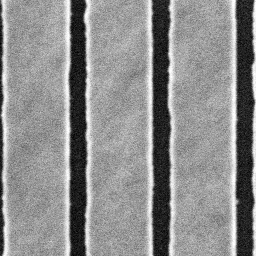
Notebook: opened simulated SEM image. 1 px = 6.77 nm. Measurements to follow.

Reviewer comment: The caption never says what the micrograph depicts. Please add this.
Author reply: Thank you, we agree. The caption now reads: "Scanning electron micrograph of lines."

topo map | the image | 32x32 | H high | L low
HHHHHHHHHLLHHHHHHHHLLHHHHHHHHLLL
HHHHHHHHHLLHHHHHHHHLLHHHHHHHHLLL
HHHHHHHHHLLHHHHHHHHLLHHHHHHHHLLL
HHHHHHHHHLLHHHHHHHHLLHHHHHHHHLLL
HHHHHHHHHLLHHHHHHHHLLHHHHHHHHLLL
HHHHHHHHHLLHHHHHHHHLLHHHHHHHHLLL
HHHHHHHHHLLHHHHHHHHLLHHHHHHHHLLL
HHHHHHHHHLLHHHHHHHHLLHHHHHHHHLLL
HHHHHHHHHLLHHHHHHHHLLHHHHHHHHLLL
HHHHHHHHLLLHHHHHHHHLLHHHHHHHHLLL
HHHHHHHHLLLHHHHHHHHLLHHHHHHHHLLL
HHHHHHHHHLLHHHHHHHHLLHHHHHHHHLLL
HHHHHHHHHLLHHHHHHHHLLHHHHHHHHLLL
HHHHHHHHHLLHHHHHHHHLLHHHHHHHHLLL
HHHHHHHHHLLHHHHHHHHLLHHHHHHHHLLL
HHHHHHHHHLLHHHHHHHHLLHHHHHHHHLLL
HHHHHHHHHLLHHHHHHHHLLHHHHHHHHLLL
HHHHHHHHHLLHHHHHHHHLLHHHHHHHHLLL
HHHHHHHHHLLHHHHHHHHLLHHHHHHHHLLL
HHHHHHHHHLLHHHHHHHHLLHHHHHHHHLLL
HHHHHHHHHLLHHHHHHHHLLHHHHHHHHLLL
HHHHHHHHHLLHHHHHHHHLLHHHHHHHHLLL
HHHHHHHHHLLHHHHHHHHLLHHHHHHHHLLL
HHHHHHHHHLLHHHHHHHHLLHHHHHHHHLLL
HHHHHHHHHLLHHHHHHHHLLHHHHHHHHLLL
HHHHHHHHHLLHHHHHHHHLLHHHHHHHHLLL
HHHHHHHHHLLHHHHHHHHLLHHHHHHHHLLL
LHHHHHHHHLLHHHHHHHHLLHHHHHHHHLLL
HHHHHHHHHLLHHHHHHHHLLHHHHHHHHLLL
LHHHHHHHHLLHHHHHHHHLLHHHHHHHHLLL
LHHHHHHHHLLHHHHHHHHLLHHHHHHHHLLL
HHHHHHHHHLLHHHHHHHHLLHHHHHHHHLLL